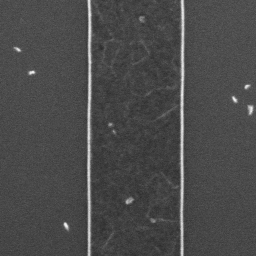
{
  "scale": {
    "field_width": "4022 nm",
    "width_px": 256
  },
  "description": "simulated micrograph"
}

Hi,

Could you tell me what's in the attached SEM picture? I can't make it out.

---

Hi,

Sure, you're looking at wiring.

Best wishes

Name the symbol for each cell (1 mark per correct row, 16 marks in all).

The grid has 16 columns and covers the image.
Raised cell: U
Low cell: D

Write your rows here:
DDDDDDUUUUUDDDDD
DDDDDDUUUUUDDDDD
DDDDDDUUUUUDDDDD
DDDDDDUUUUUDDDDD
DDDDDDUUUUUDDDDD
DDDDDDUUUUUDDDDD
DDDDDDUUUUUDDDDD
DDDDDDUUUUUDDDDD
DDDDDDUUUUUDDDDD
DDDDDDUUUUUDDDDD
DDDDDDUUUUUDDDDD
DDDDDDUUUUUDDDDD
DDDDDDUUUUUDDDDD
DDDDDDUUUUUDDDDD
DDDDDDUUUUUDDDDD
DDDDDDUUUUUDDDDD